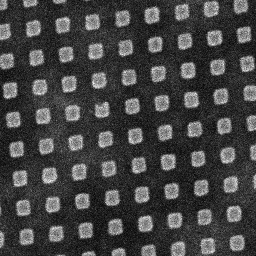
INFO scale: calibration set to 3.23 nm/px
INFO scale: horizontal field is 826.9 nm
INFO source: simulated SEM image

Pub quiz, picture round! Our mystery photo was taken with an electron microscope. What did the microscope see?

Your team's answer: a regular array of raised bodies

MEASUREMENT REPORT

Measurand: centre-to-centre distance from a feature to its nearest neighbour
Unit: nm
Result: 95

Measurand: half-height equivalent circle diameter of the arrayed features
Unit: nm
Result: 48.4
